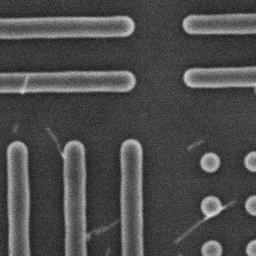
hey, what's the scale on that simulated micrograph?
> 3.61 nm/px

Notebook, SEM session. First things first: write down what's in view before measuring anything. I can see groups of lines, slits or small figures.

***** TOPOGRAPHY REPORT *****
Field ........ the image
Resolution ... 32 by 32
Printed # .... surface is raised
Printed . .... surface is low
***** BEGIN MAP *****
................................
................................
################.......#########
#################......#########
################................
................................
................................
................................
..............................##
#################......#########
#################......#########
..#.............................
................................
................................
................................
................................
................................
................................
.##.....##.....###..............
.##.....###....###........#....#
.##.....###....###.......##....#
.##.....###....###..............
.##.....###....###..............
.###....###....###..............
.###....###....###..............
.###....###....###.......###...#
.###....###....###.......##....#
.##.....###....###..............
.##.....###....###..............
.##.....###....###..............
.###....###....###........#....#
.###....###....###.......###...#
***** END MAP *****